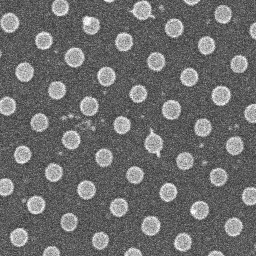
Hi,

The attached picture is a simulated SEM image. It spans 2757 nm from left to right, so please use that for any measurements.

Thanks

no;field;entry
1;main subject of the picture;a regular array of raised bodies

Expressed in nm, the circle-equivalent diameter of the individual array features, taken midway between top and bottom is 180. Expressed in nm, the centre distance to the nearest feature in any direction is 389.